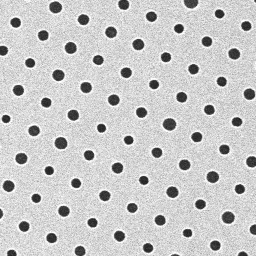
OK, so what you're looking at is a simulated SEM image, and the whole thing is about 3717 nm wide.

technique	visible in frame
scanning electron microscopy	a regular array of holes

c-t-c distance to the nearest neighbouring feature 433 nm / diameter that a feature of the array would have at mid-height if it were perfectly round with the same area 0.16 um